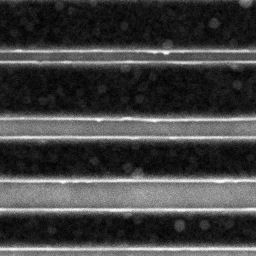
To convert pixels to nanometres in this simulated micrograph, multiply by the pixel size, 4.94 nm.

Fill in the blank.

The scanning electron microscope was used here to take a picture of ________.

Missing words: one or a few lines or trenches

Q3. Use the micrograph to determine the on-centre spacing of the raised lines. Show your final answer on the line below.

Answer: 0.342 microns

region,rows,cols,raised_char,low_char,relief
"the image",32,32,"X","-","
XXXXXXXXXXXXXXXXXXXXXXXXXXXXXXXX
XXXXXXXXXXXXXXXXXXXXXXXXXXXXXXXX
XXXXXXXXXXXXXXXXXXXXXXXXXXXXXXXX
XXXXXXXXXXXXXXXXXXXXXXXXXXXXXXXX
XXXXXXXXXXXXXXXXXXXXXXXXXXXXXXXX
XXXXXXXXXXXXXXXXXXXXXXXXXXXXXXXX
----------X------XXXXXXX--------
--------------------------------
XXXXXXXXXXXXXXXXXXXXXXXXXXXXXXXX
XXXXXXXXXXXXXXXXXXXXXXXXXXXXXXXX
XXXXXXXXXXXXXXXXXXXXXXXXXXXXXXXX
XXXXXXXXXXXXXXXXXXXXXXXXXXXXXXXX
XXXXXXXXXXXXXXXXXXXXXXXXXXXXXXXX
XXXXXXXXXXXXXXXXXXXXXXXXXXXXXXXX
XXXXXXXXXXXXXXXXXXXXXXXXXXXXXXXX
--------------------------------
--------------------------------
XXXXXXXXXXXXXXXXXXXXXXXXXXXXXXXX
XXXXXXXXXXXXXXXXXXXXXXXXXXXXXXXX
XXXXXXXXXXXXXXXXXXXXXXXXXXXXXXXX
XXXXXXXXXXXXXXXXXXXXXXXXXXXXXXXX
XXXXXXXXXXXXXXXXXXXXXXXXXXXXXXXX
XXXXXXXXXXXXXXXXXXXXXXXXXXXXXXXX
--------------------------------
--------------------------------
--------------------------------
XXXXXXXXXXXXXXXXXXXXXXXXXXXXXXXX
XXXXXXXXXXXXXXXXXXXXXXXXXXXXXXXX
XXXXXXXXXXXXXXXXXXXXXXXXXXXXXXXX
XXXXXXXXXXXXXXXXXXXXXXXXXXXXXXXX
XXXXXXXXXXXXXXXXXXXXXXXXXXXXXXXX
--------------------------------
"